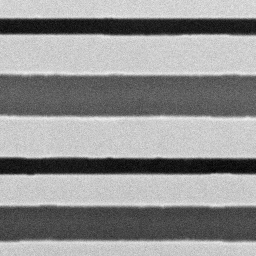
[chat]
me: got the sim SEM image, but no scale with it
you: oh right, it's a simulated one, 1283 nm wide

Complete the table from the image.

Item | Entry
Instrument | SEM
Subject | lines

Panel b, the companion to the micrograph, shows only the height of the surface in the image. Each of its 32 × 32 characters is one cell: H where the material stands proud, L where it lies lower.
HHHHHHHHHHHHHHHHHHHHHHHHHHHHHHHH
HHHHHHHHHHHHHHHHHHHHHHHHHHHHHHHH
LLLLLLLLLLLLLLLLLLLLLLLLLLLLLLLL
LLLLLLLLLLLLLLLLLLLLLLLLLLLLLLLL
HHHHHHHHHHHHHHHHHHHHHHHHHHHHHHHH
HHHHHHHHHHHHHHHHHHHHHHHHHHHHHHHH
HHHHHHHHHHHHHHHHHHHHHHHHHHHHHHHH
HHHHHHHHHHHHHHHHHHHHHHHHHHHHHHHH
HHHHHHHHHHHHHHHHHHHHHHHHHHHHHHHH
LLLLLLLLLLLLLLLLLLLLLLLLLLLLLLLL
LLLLLLLLLLLLLLLLLLLLLLLLLLLLLLLL
LLLLLLLLLLLLLLLLLLLLLLLLLLLLLLLL
LLLLLLLLLLLLLLLLLLLLLLLLLLLLLLLL
LLLLLLLLLLLLLLLLLLLLLLLLLLLLLLLL
LLLLLLLLLLLLLLLLLLLLLLLLLLLLLLLL
HHHHHHHHHHHHHHHHHHHHHHHHHHHHHHHH
HHHHHHHHHHHHHHHHHHHHHHHHHHHHHHHH
HHHHHHHHHHHHHHHHHHHHHHHHHHHHHHHH
HHHHHHHHHHHHHHHHHHHHHHHHHHHHHHHH
HHHHHHHHHHHHHHHHHHHHHHHHHHHHHHHH
LLLLLLLLLLLLLLLLLLLLLLLLLLLLLLLL
LLLLLLLLLLLLLLLLLLLLLLLLLLLLLLLL
HHHHHHHHHHHHHHHHHHHHHHHHHHHHHHHH
HHHHHHHHHHHHHHHHHHHHHHHHHHHHHHHH
HHHHHHHHHHHHHHHHHHHHHHHHHHHHHHHH
HHHHHLLHHHHHHHHHHHHHHHHHHHHHHHHH
LLLLLLLLLLLLLLLLLLLLLLLLLLLLLLLL
LLLLLLLLLLLLLLLLLLLLLLLLLLLLLLLL
LLLLLLLLLLLLLLLLLLLLLLLLLLLLLLLL
LLLLLLLLLLLLLLLLLLLLLLLLLLLLLLLL
HHHHHHHHHHHHHHHHHHHHHHHHHHHHHHHH
HHHHHHHHHHHHHHHHHHHHHHHHHHHHHHHH